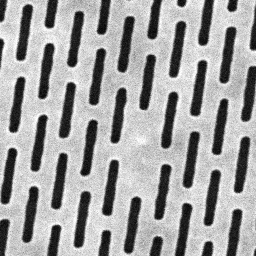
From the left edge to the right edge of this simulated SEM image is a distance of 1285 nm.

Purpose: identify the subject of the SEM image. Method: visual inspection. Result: a regular array of holes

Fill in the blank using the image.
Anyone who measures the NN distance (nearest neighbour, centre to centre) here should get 217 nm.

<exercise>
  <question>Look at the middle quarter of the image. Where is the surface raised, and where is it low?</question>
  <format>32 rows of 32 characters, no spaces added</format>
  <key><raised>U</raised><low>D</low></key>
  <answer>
UDDUUUUDDDUUUDDDUUUUDDDUUUDDDUUU
UUUUUUUDDDUUUDDDUUUUDDDUUUDDDUUU
UUUUUUUDDDUUUUUUUUUUDDDUUUDDDUUU
UUUUUUUDDDUUUUUUUUUUDDUUUUUUUUUU
UDUUUUUDDUUUUUUUUUUUDDUUUUUUUUUU
DDDUUUUDDUUUUUUUUUUDDDUUUUUUUUUU
DDDUUUDDDUUUUUDDUUUDDDUUUUUUUUUU
DDDUUUDDDUUUUDDDUUUDDDUUUUDDUUUU
DDDUUUDDDUUUUDDDUUUDDDUUUUDDDUUU
DDDUUUDDDUUUUDDDUUUDDUUUUUDDUUUU
DDDUUUUUUUUUUDDUUUUDDUUUUUDDUUUU
DDUUUUUUUUUUUDDUUUUUDUUUUDDDUUUU
DDUUUUUUUUUUDDDUUUUUUUUUUDDDUUUD
DDUUUUUUUUUUDDDUUUUUUUUUUDDDUUUU
DDUUUUDDUUUUDDDUUUUUUUUUUDDDUUUU
DDUUUUDDUUUUDDDUUUUUUUUUUDDUUUUU
DDUUUUDDUUUUDDUUUUUUUUUUUDDUUUUU
DUUUUDDDUUUUDDUUUUUUUUUUDDDUUUUU
UUUUUDDDUUUUDDUUUUUUUUUUDDDUUUUD
UUUUUDDDUUUUDDUUUUUUUUUUDDDUUUUD
UUUUUDDDUUUUUUUUUUUUUUUUDDUUUUUD
UUUUUDDDUUUUUUUUUUUUUUUUUUUUUUUD
DUUUUDDUUUUUUUUUUUUUUUUUUUUUUUUD
DUUUUDDUUUUUUUUUUUUUUUUUUUUUUUDD
DUUUUDDUUUUUDDUUUUUUUUUUUUUUUUDD
DUUUUDDUUUUDDDUUUUUUUUUUDDDUUUDD
DUUUDDDUUUUDDDUUUUUUUUUUDDDUUUDD
UUUUDDUUUUUDDDUUUUUUUUUUDDDUUUDD
UUUUUUUUUUUDDUUUUUUUUUUUDDDUUUDD
UUUUUUUUUUUDDUUUUUUUUUUUDDUUUUDD
UUUUUUUUUUUDDUUUUUUUUUUDDDUUUUDD
UUUUUUUUUUDDDUUUUUUUUUUDDDUUUUUU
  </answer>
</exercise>